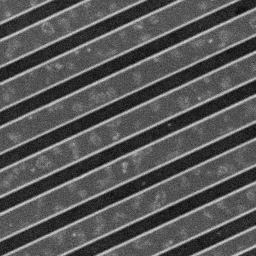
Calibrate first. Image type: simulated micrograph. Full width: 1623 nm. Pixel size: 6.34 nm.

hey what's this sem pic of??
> parallel lines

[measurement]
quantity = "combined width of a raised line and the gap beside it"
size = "0.249 um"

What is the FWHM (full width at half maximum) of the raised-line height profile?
154 nanometers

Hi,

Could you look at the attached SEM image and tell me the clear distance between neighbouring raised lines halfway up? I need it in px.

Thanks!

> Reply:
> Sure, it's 15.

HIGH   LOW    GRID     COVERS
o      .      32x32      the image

ooooo.....ooooooo....oooooooo...
ooo.....ooooooo....ooooooo.....o
o....oooooooo....ooooooo.....ooo
...ooooooo.....ooooooo.....ooooo
.ooooooo.....ooooooo.....ooooooo
oooooo.....ooooooo....oooooooo..
oooo.....ooooooo....ooooooo.....
oo....oooooooo....ooooooo.....oo
....ooooooo.....ooooooo.....oooo
..ooooooo.....ooooooo....ooooooo
ooooooo.....ooooooo....ooooooo..
ooooo....oooooooo....ooooooo....
ooo....ooooooo.....ooooooo.....o
o....ooooooo.....ooooooo.....ooo
...ooooooo.....ooooooo....oooooo
.ooooooo.....ooooooo....ooooooo.
oooooo....oooooooo....ooooooo...
oooo....ooooooo.....ooooooo.....
oo....ooooooo.....ooooooo....ooo
....ooooooo.....ooooooo....ooooo
..ooooooo....oooooooo....ooooooo
ooooooo....ooooooo.....ooooooo..
ooooo....ooooooo.....ooooooo....
ooo....ooooooo.....ooooooo....oo
.....ooooooo.....ooooooo....oooo
...ooooooo....oooooooo....oooooo
.ooooooo....ooooooo.....ooooooo.
oooooo....ooooooo.....ooooooo...
ooo.....ooooooo.....ooooooo.....
o.....ooooooo....oooooooo....ooo
....ooooooo....ooooooo.....ooooo
.oooooooo....ooooooo.....ooooo..